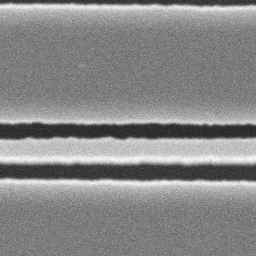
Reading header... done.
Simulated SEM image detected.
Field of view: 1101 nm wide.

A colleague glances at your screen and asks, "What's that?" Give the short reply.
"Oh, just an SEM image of lines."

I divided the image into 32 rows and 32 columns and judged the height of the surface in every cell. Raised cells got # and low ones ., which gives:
................................
################################
################################
################################
################################
################################
################################
################################
################################
################################
################################
################################
################################
################################
################################
................................
................................
...############.################
################################
################################
................................
................................
######.###......................
################################
################################
################################
################################
################################
################################
################################
################################
################################